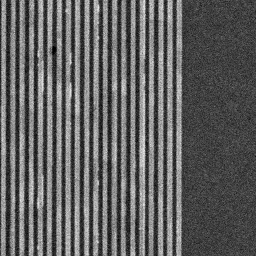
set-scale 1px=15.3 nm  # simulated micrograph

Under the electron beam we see parallel lines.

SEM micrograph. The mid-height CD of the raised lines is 59.3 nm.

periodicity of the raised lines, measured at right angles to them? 0.141 micrometres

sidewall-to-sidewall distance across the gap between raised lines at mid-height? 0.088 micrometres